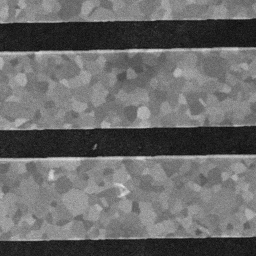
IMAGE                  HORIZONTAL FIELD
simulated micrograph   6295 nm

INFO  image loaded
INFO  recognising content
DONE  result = lines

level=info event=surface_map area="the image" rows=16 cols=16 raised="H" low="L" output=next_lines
HHHHHHHHHHHHHHHH
LLLLLLLLLLLLLLLL
LLLLLLLLLLLLLLLL
HHHHHHHHHHHHHHHH
HHHHHHHHHHHHHHHH
HHHHHHHHHHHHHHHH
HHHHHHHHHHHHHHHH
HHHHHHHHHHHHHHHH
LLLLLLLLLLLLLLLL
LLLLLLLLLLLLLLLL
HHHHHHHHHHHHHHHH
HHHHHHHHHHHHHHHH
HHHHHHHHHHHHHHHH
HHHHHHHHHHHHHHHH
HHHHHHHHHHHHHHHH
LLLLLLLLLLLLLLLL